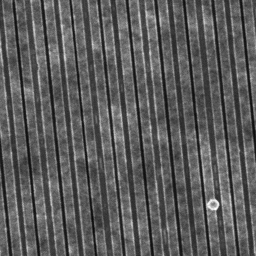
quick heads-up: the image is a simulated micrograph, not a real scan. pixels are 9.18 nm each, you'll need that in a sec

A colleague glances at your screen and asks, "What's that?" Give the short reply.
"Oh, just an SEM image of parallel lines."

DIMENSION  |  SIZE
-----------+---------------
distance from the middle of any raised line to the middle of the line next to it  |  130 nanometers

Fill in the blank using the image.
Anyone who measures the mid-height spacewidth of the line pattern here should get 3.73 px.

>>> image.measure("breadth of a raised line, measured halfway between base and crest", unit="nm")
85.6